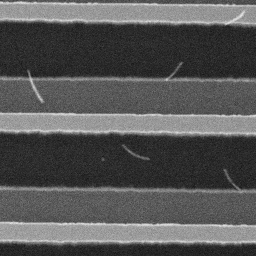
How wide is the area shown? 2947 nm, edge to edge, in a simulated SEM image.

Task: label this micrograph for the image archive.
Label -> lines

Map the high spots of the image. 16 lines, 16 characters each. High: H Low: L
HHHHHHHHHHHHHHHH
LLLLLLLLLLLLLLLL
LLLLLLLLLLLLLLLL
LLLLLLLLLLLLLLLL
LLLLLLLLLLLLLLLL
HHHHHHHHHHHHHHHH
HHHHHHHHHHHHHHHH
HHHHHHHHHHHHHHHH
LLLLLLLLLLLLLLLL
LLLLLLLLLLLLLLLL
LLLLLLLLLLLLLLLL
LLLLLLLLLLLLLLLL
HHHHHHHHHHHHHHHH
HHHHHHHHHHHHHHHH
HHHHHHHHHHHHHHHH
LLLLLLLLLLLLLLLL